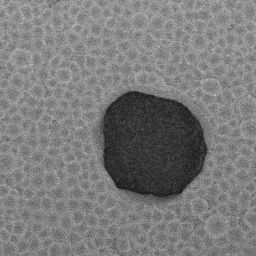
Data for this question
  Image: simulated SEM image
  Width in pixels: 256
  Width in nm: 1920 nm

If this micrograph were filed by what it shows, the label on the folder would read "holes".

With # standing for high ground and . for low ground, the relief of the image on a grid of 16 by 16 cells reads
################
################
################
################
################
################
#######....#####
######......####
######.......###
######.......###
#######......###
#######.....####
##########.#####
################
################
################